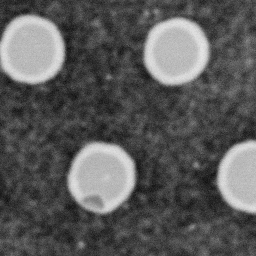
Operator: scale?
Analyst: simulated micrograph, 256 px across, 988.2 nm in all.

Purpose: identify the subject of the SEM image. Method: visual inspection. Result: raised bodies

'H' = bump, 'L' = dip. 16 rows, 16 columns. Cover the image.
LLLLLLLLLLLLLLLL
LHHLLLLLLLHHLLLL
HHHHLLLLLHHHHLLL
HHHHLLLLLHHHHLLL
LHHLLLLLLLHHLLLL
LLLLLLLLLLLLLLLL
LLLLLLLLLLLLLLLL
LLLLLLLLLLLLLLLL
LLLLLLLLLLLLLLLL
LLLLLHHLLLLLLLLH
LLLLLHHHLLLLLLHH
LLLLHHHHLLLLLLHH
LLLLLLHHLLLLLLHH
LLLLLLLLLLLLLLLL
LLLLLLLLLLLLLLLL
LLLLLLLLLLLLLLLL